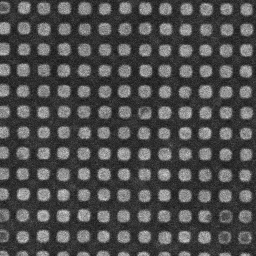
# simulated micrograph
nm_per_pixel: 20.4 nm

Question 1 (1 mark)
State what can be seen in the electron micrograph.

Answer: a regular array of raised bodies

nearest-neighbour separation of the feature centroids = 407 nanometres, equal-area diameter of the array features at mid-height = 12.5 pixels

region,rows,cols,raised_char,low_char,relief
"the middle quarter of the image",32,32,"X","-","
X---XX---XX---XX---XXX--XX------
X---XX---XXX--XX---XXX--XXX--XXX
X---XX---XX---XX---XXX--XXX--XXX
--------------------------------
--------------------------------
X-------------------------------
X---XX---XXX--XX---XXX--XXX--XXX
X---XX---XXX--XX---XXX--XXX--XXX
--------------------------------
--------------------------------
--------------------------------
X---XXX--XXX--XXX--XXX--XXX--XXX
X---XXX--XXX--XXX--XXX--XXX--XXX
-------------------XX--------XX-
--------------------------------
--------------------------------
X---XXX--XX---XX---XX---XX---XXX
X---XX---XX---XX---XX---XX---XXX
-------------------XX---XX---XX-
--------------------------------
--------------------------------
X---XX---XX---XX---XX---XX---XX-
X---XX---XXX--XX---XX---XX---XXX
X---XX---XX---XX---XX---XX---XXX
--------------------------------
--------------------------------
X---XX---XX---XX---XX---XX------
X---XX---XX---XX---XX---XX---XXX
X---XX---XX---XX---XX---XX---XXX
--------------------------------
--------------------------------
X---XX---XX---XX----------------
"